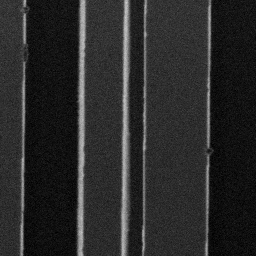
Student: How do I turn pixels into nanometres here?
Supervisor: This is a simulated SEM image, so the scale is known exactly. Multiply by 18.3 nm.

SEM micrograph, lines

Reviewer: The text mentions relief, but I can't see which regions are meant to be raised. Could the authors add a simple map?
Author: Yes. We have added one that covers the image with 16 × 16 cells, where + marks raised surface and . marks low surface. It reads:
++...++++++++...
++...++++++++...
++...++++++++...
++...++++++++...
++...++++++++...
++...++++++++...
+....++++++++...
+....++++++++...
+....++++++++...
+....++++++++...
+....++++++++...
+....++++++++...
+....++++++++...
+....++++++++...
+....++++++++...
+....++++++++...